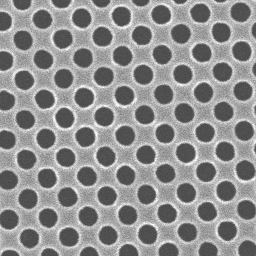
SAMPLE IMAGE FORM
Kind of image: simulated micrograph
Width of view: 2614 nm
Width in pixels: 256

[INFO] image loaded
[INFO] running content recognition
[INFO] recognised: a regular array of holes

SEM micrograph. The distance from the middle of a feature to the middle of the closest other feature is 283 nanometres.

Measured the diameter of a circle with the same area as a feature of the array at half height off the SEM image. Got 202 nanometres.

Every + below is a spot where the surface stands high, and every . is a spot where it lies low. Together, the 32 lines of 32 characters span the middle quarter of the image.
++++..++++++++++++...+++++++...+
.+++++++....++++++....++++++....
..++++++....+++++.....+++++.....
..+++++.....++++++....+++++.....
..++++++....++++++....++++++...+
..+++++++..+++..+++++++...++++++
+++....++++++....++++++....+++++
+++....++++++.....++++.....+++++
+++.....+++++.....+++++....+++++
+++....++++++....+++++++...+++++
++++..+++++++++++++..+++++++....
..++++++....++++++....++++++....
..++++++....++++++.....+++++....
...+++++.....+++++.....+++++....
..++++++....+++++++...+++++++..+
..+++++++..+++++++++++++..++++++
+++....++++++....++++++....+++++
+++.....+++++.....+++++.....++++
+++.....+++++.....+++++....+++++
+++.....+++++....+++++++...+++++
++++...++++++++.+++...+++++++...
..+++++++...++++++....++++++....
...+++++.....+++++.....+++++....
...+++++.....+++++.....+++++....
...++++++....++++++...+++++++...
..++++++++..+++.++++++++...+++++
++++...++++++....++++++.....++++
+++.....+++++.....+++++.....++++
+++.....+++++.....+++++.....++++
++++....++++++...++++++++..+++++
+++++..+++.++++++++...+++++++...
...++++++....+++++.....+++++....